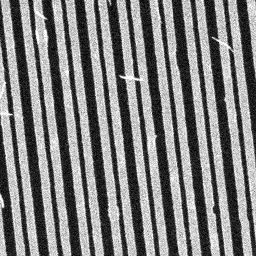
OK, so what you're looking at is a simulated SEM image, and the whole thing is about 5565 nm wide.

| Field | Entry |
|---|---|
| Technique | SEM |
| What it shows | parallel lines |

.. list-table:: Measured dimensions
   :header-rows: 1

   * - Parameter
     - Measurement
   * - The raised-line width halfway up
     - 167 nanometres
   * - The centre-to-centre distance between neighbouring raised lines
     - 0.349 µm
